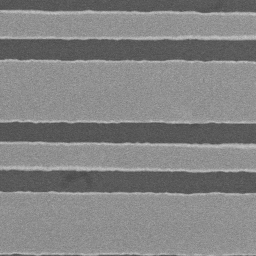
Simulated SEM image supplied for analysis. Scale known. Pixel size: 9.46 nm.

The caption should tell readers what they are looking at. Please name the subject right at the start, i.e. lines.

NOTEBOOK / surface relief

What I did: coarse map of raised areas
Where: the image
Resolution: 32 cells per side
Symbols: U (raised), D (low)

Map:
DDDDDDDDDDDDDDDDDDDDDDDDDDDDDDDD
UUUUUUDUUUUUUUUUUUDUUUDDDDDDDDDD
UUUUUUUUUUUUUUUUUUUUUUUUUUUUUUUU
UUUUUUUUUUUUUUUUUUUUUUUUUUUUUUUU
UUUUUUUUUUUUUUUUUUUUUUUUUUUUUUUU
DDDDDDDDDDDDDDDDDDDDDDDDDDDDDDDD
DDDDDDDDDDDDDDDDDDDDDDDDDDDDDDDD
UUDDDDDDDDDDDDDDDDDDDDDDDDDDDDDD
UUUUUUUUUUUUUUUUUUUUUUUUUUUUUUUU
UUUUUUUUUUUUUUUUUUUUUUUUUUUUUUUU
UUUUUUUUUUUUUUUUUUUUUUUUUUUUUUUU
UUUUUUUUUUUUUUUUUUUUUUUUUUUUUUUU
UUUUUUUUUUUUUUUUUUUUUUUUUUUUUUUU
UUUUUUUUUUUUUUUUUUUUUUUUUUUUUUUU
UUUUUUUUUUUUUUUUUUUUUUUUUUUUUUUU
DDDDDDDDDDDDDDDDDDDDDDDDDDDDDDDD
DDDDDDDDDDDDDDDDDDDDDDDDDDDDDDDD
DDDDDDDDDDDDDDDDDDDDDDDDDDDDDDDD
UUUUUUUUUUUUUUUUUUUUUUUUUUUUUUUU
UUUUUUUUUUUUUUUUUUUUUUUUUUUUUUUU
UUUUUUUUUUUUUUUUUUUUUUUUUUUUUUUU
DDDDDDDDDDDDDDDDDDDDDDDDDDDDDDDD
DDDDDDDDDDDDDDDDDDDDDDDDDDDDDDDD
DDDDDDDDDDDDDDDDDDDDDDDDDDDDDDDD
UUUUUUUUUUUUUUUUUUUUUUUUUUUUUUUU
UUUUUUUUUUUUUUUUUUUUUUUUUUUUUUUU
UUUUUUUUUUUUUUUUUUUUUUUUUUUUUUUU
UUUUUUUUUUUUUUUUUUUUUUUUUUUUUUUU
UUUUUUUUUUUUUUUUUUUUUUUUUUUUUUUU
UUUUUUUUUUUUUUUUUUUUUUUUUUUUUUUU
UUUUUUUUUUUUUUUUUUUUUUUUUUUUUUUU
UUUUUUUUUUUUUUUUUUUUUUUUUUUUUUUU